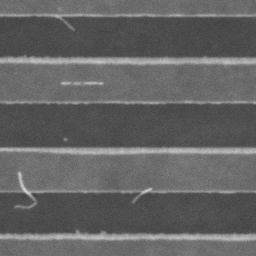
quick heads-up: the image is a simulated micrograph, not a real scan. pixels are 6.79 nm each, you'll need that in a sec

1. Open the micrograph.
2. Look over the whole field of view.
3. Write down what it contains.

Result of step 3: lines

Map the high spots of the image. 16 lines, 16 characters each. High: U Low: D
UUUUUUUUUUUUUUUU
DDDDDDDDDDDDDDDD
DDDDDDDDDDDDDDDD
DDDDDDDDDDDDDDDD
UUUUUUUUUUUUUUUU
UUUUUUUUUUUUUUUU
DDDDDDDDDDDDDDDD
DDDDDDDDDDDDDDDD
DDDDDDDDDDDDDDDD
UUUUUUUUUUUUUUUU
UUUUUUUUUUUUUUUU
UUUUUUUUUUUUUUUU
DDDDDDDDDDDDDDDD
DDDDDDDDDDDDDDDD
DDDDDDDDDDDDDDDD
UUUUUUUUUUUUUUUU